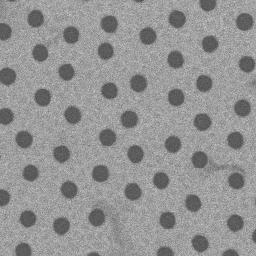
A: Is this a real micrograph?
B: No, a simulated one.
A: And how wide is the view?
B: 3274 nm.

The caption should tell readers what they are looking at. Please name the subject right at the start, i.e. a regular array of holes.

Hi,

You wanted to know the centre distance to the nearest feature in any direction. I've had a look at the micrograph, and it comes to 431 nm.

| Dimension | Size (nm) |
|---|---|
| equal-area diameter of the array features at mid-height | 211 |